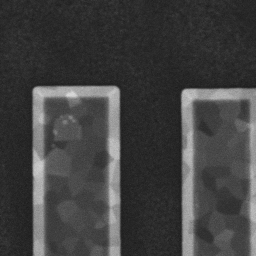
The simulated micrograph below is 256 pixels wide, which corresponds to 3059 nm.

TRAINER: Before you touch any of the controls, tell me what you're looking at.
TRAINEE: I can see one or a few lines or trenches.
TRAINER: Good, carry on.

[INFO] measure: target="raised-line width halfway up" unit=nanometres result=896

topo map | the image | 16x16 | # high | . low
................
................
................
................
................
................
..#####.....####
..#####.....####
..#####.....####
..#####.....####
..#####.....####
..#####.....####
..#####.....####
..#####.....####
..#####.....####
..#####.....####